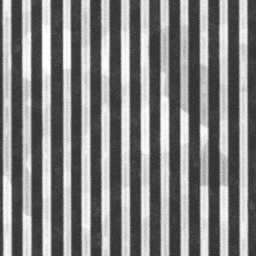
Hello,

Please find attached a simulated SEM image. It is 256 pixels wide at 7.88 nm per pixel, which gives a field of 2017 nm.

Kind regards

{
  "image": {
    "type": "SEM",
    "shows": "parallel lines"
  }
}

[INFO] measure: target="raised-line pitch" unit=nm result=155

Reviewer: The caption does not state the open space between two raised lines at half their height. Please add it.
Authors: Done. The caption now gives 112 nm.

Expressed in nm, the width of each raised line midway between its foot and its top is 49.2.